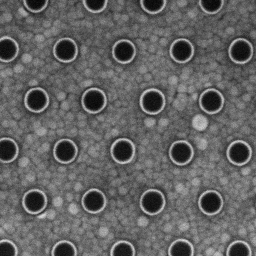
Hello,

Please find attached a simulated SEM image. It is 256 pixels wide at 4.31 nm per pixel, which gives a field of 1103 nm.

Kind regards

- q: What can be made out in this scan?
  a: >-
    a regular array of raised bodies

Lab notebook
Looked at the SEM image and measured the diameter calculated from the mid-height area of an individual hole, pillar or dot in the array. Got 101 nanometers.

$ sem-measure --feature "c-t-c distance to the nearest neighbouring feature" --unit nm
248